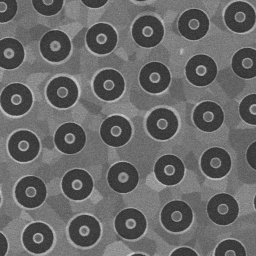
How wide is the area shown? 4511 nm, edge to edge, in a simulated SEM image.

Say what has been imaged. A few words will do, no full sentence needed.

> an array of small figures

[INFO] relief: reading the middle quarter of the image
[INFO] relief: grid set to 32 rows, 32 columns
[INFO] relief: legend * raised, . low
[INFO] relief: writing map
********************.....*****..
*********....******.......****..
********......*****...*....***..
..*****........****...**...****.
...****...**...****........****.
....***...**...****.......******
*...***........*****.....*******
*...****.......*******..********
....*****.....******************
...*****************************
..******************************
**********************.....*****
*********************.......****
***********.....****.........***
**********.......***...***...***
....*****........***....**...***
.....****...**...***........****
.....****...**...****.......****
**....***........*****.....*****
.*....****......****************
.....******...******************
....****************************
..******************************
************************.....***
**************..*******.......**
************.....******...*...**
*....******.......****...***..**
......*****........****.......**
.......****...*....****.......**
...*...****........*****.....***
..**...****.......**************
.......*****.....***************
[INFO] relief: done